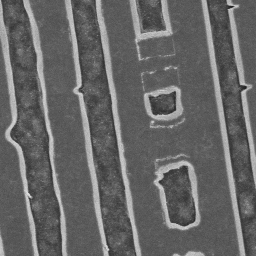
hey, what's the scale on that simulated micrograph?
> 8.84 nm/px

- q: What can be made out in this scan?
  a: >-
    one or a few lines or trenches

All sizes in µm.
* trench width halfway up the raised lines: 0.27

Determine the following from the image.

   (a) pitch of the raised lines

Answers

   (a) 594 nm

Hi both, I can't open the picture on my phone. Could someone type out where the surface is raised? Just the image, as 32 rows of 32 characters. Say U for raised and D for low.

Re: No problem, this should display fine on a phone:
DDDUUUUUUDDDUUUUUDDDUUUUUUDDDUUU
DDDDUUUUUDDDUUUUUDDDDUUUUUDDDUUU
DDDDUUUUUDDDUUUUUDDDDUUUUUDDDUUU
DDDDUUUUUDDDDUUUUDDDDUUUUUDDDUUU
UDDDUUUUUDDDDUUUUUUUUUUUUUDDDUUU
UDDDUUUUUDDDDUUUUUUUUUUUUUDDDUUU
UDDDDUUUUUDDDUUUUUUUUUUUUUUDDDUU
UDDDDUUUUUDDDUUUUUUUUUUUUUUDDDUU
UDDDDUUUUUDDDDUUUUUUUUUUUUUDDDUU
UDDDDUUUUUDDDDUUUUUUUUUUUUUDDDUU
UDDDDUUUUUDDDDUUUUUUUUUUUUUDDDDU
UUDDDDUUUUDDDDUUUUUUDDUUUUUDDDUU
UUDDDDUUUUDDDDUUUUDDDDUUUUUDDDUU
UUDDDDUUUUDDDDUUUUUDDDUUUUUUDDDU
UUDDDDUUUUUDDDUUUUUDDUUUUUUUDDDU
UUDDDDUUUUUDDDUUUUUUUUUUUUUUDDDU
UDDDDDUUUUUDDDDUUUUUUUUUUUUUDDDU
UDDDDDUUUUUDDDDUUUUUUUUUUUUUDDDU
UUDDDDUUUUUDDDDUUUUUUUUUUUUUDDDU
UUUDDDUUUUUDDDDUUUUUUUUUUUUUUDDD
UUUDDDUUUUUDDDDUUUUUUUUUUUUUUDDD
UUUDDDDUUUUUDDDDUUUUDDDDUUUUUDDD
UUUDDDDUUUUUDDDDUUUUDDDDUUUUUDDD
UUUDDDDUUUUUDDDDUUUUDDDDUUUUUDDD
UUUUDDDUUUUUDDDDUUUUDDDDUUUUUDDD
UUUUDDDDUUUUDDDDUUUUUDDDDUUUUDDD
UUUUDDDDUUUUDDDDUUUUUDDDDUUUUUDD
UUUUDDDDUUUUUDDDUUUUUDDDDUUUUUDD
UUUUDDDDUUUUUDDDDUUUUUUUUUUUUUDD
UUUUDDDDUUUUUDDDDUUUUUUUUUUUUUDD
UUUUDDDDUUUUUDDDDUUUUUUUUUUUUUDD
UUUUUDDDUUUUUDDDDUUUUUUUUUUUUUDD